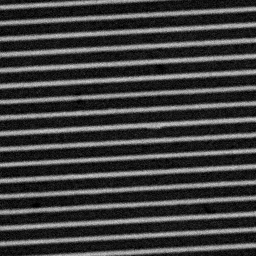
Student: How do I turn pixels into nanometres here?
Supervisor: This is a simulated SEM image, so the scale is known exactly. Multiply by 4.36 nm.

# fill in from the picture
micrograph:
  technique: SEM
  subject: parallel lines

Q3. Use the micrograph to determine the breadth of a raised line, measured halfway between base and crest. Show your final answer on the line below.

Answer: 15.8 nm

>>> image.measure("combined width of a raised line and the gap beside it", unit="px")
15.7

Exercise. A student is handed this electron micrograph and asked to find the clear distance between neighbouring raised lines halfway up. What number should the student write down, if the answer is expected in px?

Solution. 11.8